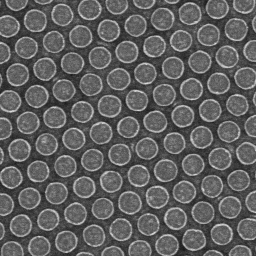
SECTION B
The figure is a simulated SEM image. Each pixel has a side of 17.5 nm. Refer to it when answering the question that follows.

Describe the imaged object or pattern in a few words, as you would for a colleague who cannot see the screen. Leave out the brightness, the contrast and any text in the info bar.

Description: a regular array of raised bodies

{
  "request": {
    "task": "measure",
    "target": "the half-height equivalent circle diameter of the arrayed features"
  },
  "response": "21.8 pixels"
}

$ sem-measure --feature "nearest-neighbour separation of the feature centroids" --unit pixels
27.6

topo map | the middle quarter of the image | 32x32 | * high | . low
*****..****........***...*****.*
****.........**...*****..*****..
......*....*****..*****..****...
....*****..*****..*****....*....
**..*****..*****...***........**
**..*****..*****........***..***
***.*****..............****..***
***..***........****..******.***
**........***...*****.******...*
....*....*****..*****..****.....
..*****..*****..*****........**.
..*****..*****...**........*****
..*****..****........****..*****
..*****........**...*****..*****
....*.........****..******..****
.......****..******.*****....**.
.***...*****.******..****.......
*****..*****..****........***...
*****..*****.............*****..
*****...***........****..*****..
****........****..*****..*****..
......**...*****..*****...***...
.....*****.*****..*****.........
**...*****.******..***........**
***.******..****........***...**
***..****.........*....*****..**
***...**........*****..*****..**
**........****..*****..*****...*
....**...*****..*****..*****....
...****..*****...****........**.
...****..*****....**........****
*..*****..***........****..*****